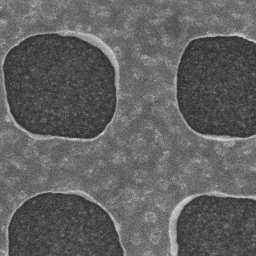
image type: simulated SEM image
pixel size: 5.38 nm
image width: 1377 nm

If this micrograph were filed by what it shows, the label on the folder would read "holes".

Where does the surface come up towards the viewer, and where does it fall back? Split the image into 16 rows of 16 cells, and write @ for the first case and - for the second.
@@@@@@@@@@@@@@@@
@@@@@@@@@@@@@@@@
@@----@@@@@@----
-------@@@@-----
-------@@@@-----
-------@@@@-----
@------@@@@-----
@------@@@@@----
@@----@@@@@@@---
@@@@@@@@@@@@@@@@
@@@@@@@@@@@@@@@@
@@@@@@@@@@@@@@@@
@@----@@@@@@----
@------@@@@-----
@------@@@@-----
@-------@@@-----